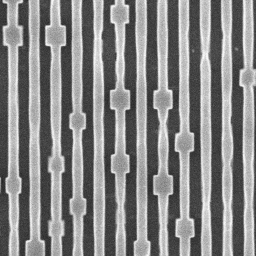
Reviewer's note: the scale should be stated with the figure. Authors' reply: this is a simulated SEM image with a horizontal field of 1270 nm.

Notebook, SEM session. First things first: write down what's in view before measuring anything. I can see wiring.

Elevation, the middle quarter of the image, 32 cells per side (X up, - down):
--XX---XX----XX---XX----XX---XX-
--XX---XX----XX---XX----XX---XX-
--XX---XXX---XX---XX----XX---XX-
--XX---XXX---XX---XX----XX---XX-
--XX---XXX---XX---XX----XX---XX-
--XX---XXX---XX---XX----XX---XX-
--XX---XXX---XXX--XX---XXX---XX-
--XX---XXX--XXXX--XX---XXXX--XX-
--XX---XXX--XXXX--XX---XXXX--XX-
--XX---XXX--XXXX--XX---XXXX--XX-
--XX---XXX--XXXX--XX---XXXX--XX-
---X---XXX---XXX--XX---XXX---XX-
--XXX--XXX---XX---XX----XX---XX-
--XXX--XXX---XX---XX----XX---XX-
--XXX--XX----XX---XX----X----XX-
--XXX--XXX---XX---XX----X----XX-
--XXX--XXX---XX---XX----X----XX-
--XX----XX---XX---XX----XX---XXX
---X----XX---XX---XX----XX--XXXX
---X----XX---XX---XX----XX--XXXX
--XX----XX---XX---XX----XX--XXXX
--XX----XX---XX---XX----XX--XXXX
--XXX---XX---XX---XX----XX---XX-
--XXX---XX--XXXX--XX----XX---XX-
--XXX---XX--XXXX--XX----XX---XX-
--XXX--XXX--XXXX--XX----XX---XX-
--XXX--XXX--XXXX--XX----XX---XX-
--XXX--XXX---XXX--XXX--XXX---XX-
--XXX--XXX---XX---XXX--XXXX--XX-
--XXX--XXX---XX---XXX--XXXX--XX-
---XX--XXX---XX---XXX--XXXX--XX-
--XXX--XXX---XX---XXX--XXXX--XX-